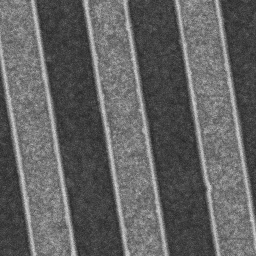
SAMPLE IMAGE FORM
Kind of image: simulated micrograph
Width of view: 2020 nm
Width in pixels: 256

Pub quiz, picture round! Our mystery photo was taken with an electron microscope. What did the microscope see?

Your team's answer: one or a few lines or trenches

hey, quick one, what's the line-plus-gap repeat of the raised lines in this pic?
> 90.8 px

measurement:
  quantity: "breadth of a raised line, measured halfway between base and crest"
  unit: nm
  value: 308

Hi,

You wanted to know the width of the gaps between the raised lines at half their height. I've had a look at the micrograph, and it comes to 410 nanometres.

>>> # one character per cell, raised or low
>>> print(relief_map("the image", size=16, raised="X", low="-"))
XX---XXX---XXX--
XX----XX---XXX--
XX----XX---XXX--
XXX---XX----XX--
XXX---XXX---XX--
XXX---XXX---XX--
-XX---XXX---XXX-
-XX----XX---XXX-
-XX----XX---XXX-
-XXX---XX----XX-
-XXX---XXX---XX-
-XXX---XXX---XX-
--XX---XXX---XXX
--XX----XX---XXX
--XX----XX---XXX
--XXX---XX----XX